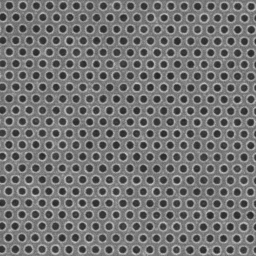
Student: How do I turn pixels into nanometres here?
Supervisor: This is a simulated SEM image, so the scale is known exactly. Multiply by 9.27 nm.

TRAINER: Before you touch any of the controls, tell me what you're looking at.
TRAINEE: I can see a regular array of holes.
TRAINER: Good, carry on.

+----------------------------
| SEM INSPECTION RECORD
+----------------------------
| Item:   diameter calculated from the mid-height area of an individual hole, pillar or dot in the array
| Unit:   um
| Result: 0.0747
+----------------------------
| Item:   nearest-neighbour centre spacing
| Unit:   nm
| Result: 121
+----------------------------